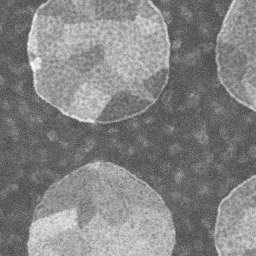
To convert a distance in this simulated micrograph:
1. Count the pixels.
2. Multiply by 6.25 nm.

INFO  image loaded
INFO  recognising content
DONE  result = raised bodies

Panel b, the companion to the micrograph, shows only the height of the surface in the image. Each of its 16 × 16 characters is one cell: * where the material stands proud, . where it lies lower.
...*******....**
..********....**
..*********...**
..*********...**
..*********...**
..********....**
...******......*
.....***........
................
................
................
...............*
..............**
..............**
.............***
..............**